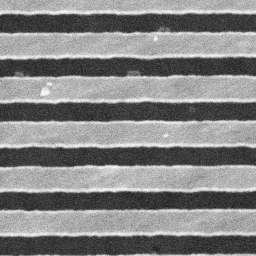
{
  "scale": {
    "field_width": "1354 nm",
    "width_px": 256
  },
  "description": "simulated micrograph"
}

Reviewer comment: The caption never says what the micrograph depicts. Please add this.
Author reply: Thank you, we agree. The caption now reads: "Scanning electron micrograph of lines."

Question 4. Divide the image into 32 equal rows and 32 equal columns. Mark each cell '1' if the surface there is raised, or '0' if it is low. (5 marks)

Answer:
11111111111111111111111111111111
11111111111111111111111111111111
00000000000000000000000000000000
00000000000000000000000000000000
11111111111111111111111111111111
11111111111111111111111111111111
11111111111111111111111111111111
00000000000000000000000000000000
00000000000000000000000000000000
00000000000000000000011110111110
11111111111111111111111111111111
11111111111111111111111111111111
11111111111111111111111111111111
00000000000000000000000000000000
00000000000000000000000000000000
11111111111111111111111111111111
11111111111111111111111111111111
11111111111111111111111111111111
00000000000000000000000000000000
00000000000000000000000000000000
00000000000000000000000000000000
11111111111111111111111111111111
11111111111111111111111111111111
11111111111111111111111111111111
00000000000000000000000000000000
00000000000000000000000000000000
11111111111111111111111111111111
11111111111111111111111111111111
11111111111111111111111111111111
11111001010010000000000000000000
00000000000000000000000000000000
00000000000000000000000000000000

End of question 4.